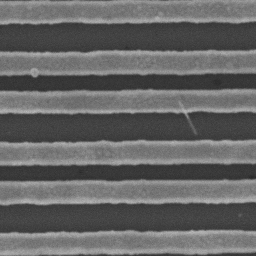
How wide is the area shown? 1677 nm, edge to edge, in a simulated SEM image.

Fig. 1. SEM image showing lines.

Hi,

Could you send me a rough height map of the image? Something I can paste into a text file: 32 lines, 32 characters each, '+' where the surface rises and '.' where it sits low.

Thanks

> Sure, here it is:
++++++++++++++++++++++++++++++++
++++++++++++++++++++++++++++++++
++++++++++++++++++++++++++++++++
................................
................................
................................
.............++.++......++++++++
++++++++++++++++++++++++++++++++
++++++++++++++++++++++++++++++++
................................
................................
++.......+++..++++++++++++++++++
++++++++++++++++++++++++++++++++
++++++++++++++++++++++++++++++++
................................
................................
................................
................................
++++++++++++++++++++++++++++++++
++++++++++++++++++++++++++++++++
+++++++++++..++.+...............
................................
................................
++++++++++++++++++++++++++++++++
++++++++++++++++++++++++++++++++
+...............................
................................
................................
................................
++++++++++++++++++++++++++++++++
++++++++++++++++++++++++++++++++
+++++++++++++++++++++.++++++....